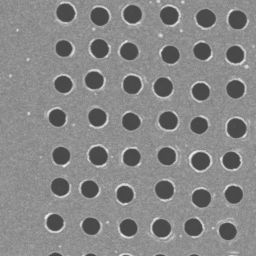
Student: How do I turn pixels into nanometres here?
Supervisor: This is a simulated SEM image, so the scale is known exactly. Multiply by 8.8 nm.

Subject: a regular array of holes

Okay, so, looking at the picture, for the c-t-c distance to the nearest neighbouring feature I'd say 285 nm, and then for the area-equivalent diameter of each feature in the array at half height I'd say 161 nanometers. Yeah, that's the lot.